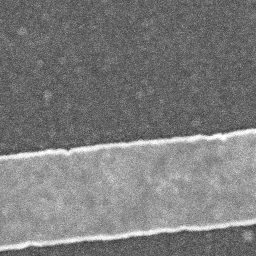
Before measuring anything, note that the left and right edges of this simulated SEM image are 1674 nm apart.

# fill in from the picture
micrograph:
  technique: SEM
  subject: one or a few lines or trenches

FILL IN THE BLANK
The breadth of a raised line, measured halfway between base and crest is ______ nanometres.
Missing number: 594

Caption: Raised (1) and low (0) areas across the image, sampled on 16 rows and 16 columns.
0000000000000000
0000000000000000
0000000000000000
0000000000000000
0000000000000000
0000000000000000
0000000000000000
0000000000000000
0000000000000011
0001111111111111
1111111111111111
1111111111111111
1111111111111111
1111111111111111
1111111111000000
1000000000000000